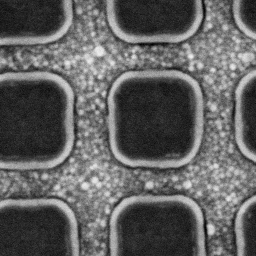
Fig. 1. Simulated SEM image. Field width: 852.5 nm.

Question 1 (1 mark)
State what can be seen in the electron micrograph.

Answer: raised bodies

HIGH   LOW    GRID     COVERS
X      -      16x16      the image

XXXX---XXXXX---X
XXXX---XXXXX---X
XXX-------------
----------------
----------------
XXXX---XXXXX---X
XXXX---XXXXX---X
XXXX---XXXXXX--X
XXXX---XXXXX---X
XXXX---XXXXX---X
----------------
----------------
--------XXX-----
XXXX---XXXXX---X
XXXXX--XXXXXX--X
XXXXX--XXXXXX--X